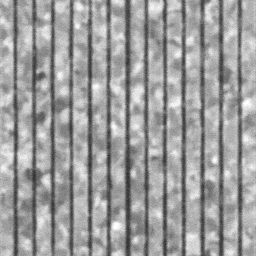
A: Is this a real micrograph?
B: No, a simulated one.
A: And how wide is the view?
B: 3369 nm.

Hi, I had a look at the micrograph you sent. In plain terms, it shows parallel lines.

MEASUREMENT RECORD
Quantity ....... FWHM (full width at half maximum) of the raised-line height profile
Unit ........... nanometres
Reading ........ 173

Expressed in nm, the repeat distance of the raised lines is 246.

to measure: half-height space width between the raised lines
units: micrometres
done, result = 0.074